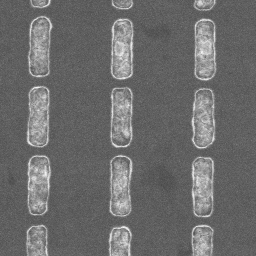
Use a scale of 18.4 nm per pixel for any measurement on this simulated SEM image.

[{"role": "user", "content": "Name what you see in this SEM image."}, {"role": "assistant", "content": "a regular array of holes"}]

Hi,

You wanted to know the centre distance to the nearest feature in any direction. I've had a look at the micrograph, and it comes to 1250 nanometres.